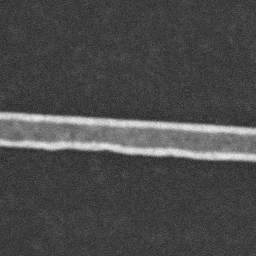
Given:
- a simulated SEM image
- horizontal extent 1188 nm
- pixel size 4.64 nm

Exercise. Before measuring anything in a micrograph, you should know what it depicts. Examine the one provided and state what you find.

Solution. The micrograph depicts one or a few lines or trenches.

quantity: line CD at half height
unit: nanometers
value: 128